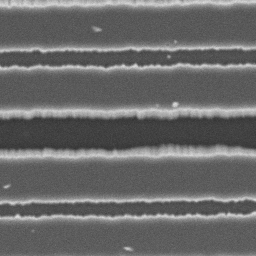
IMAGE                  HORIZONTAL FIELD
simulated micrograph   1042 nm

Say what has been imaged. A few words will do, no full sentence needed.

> lines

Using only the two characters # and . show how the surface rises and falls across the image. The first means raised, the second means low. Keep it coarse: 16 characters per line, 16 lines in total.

################
################
################
################
################
################
################
................
................
................
################
################
################
################
################
################